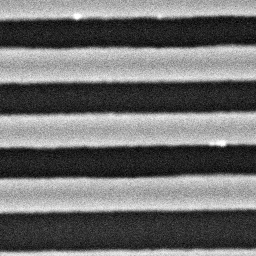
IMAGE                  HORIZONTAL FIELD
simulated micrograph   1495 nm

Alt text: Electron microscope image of lines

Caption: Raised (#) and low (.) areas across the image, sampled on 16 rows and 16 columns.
################
................
................
################
################
................
................
################
################
................
................
################
################
................
................
................